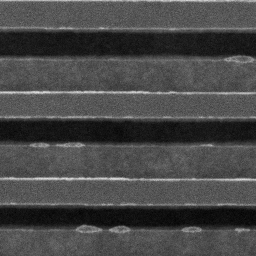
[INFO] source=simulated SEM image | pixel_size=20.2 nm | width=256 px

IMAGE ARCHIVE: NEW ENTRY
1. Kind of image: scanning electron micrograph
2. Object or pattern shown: lines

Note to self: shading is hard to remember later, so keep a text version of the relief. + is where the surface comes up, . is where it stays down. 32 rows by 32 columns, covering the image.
++++++++++++++++++++++++++++++++
++++++++++++++++++++++++++++++++
++++++++++++++++++++++++++++++++
++++++++++++++++++++++++++++++++
................................
................................
................................
++++++.....+.++.............++++
++++++++++++++++++++++++++++++++
++++++++++++++++++++++++++++++++
++++++++++++++++++++++++++++++++
++++++++++++++++++++++++++++++++
++++++++++++++++++++++++++++++++
++++++++++++++++++++++++++++++++
++++++++++++++++++++++++++++++++
................................
................................
................................
++++++++++++++++++++++++++++++++
++++++++++++++++++++++++++++++++
++++++++++++++++++++++++++++++++
++++++++++++++++++++++++++++++++
++++++++++++++++++++++++++++++++
++++++++++++++++++++++++++++++++
++++++++++++++++++++++++++++++++
++++++++++++++++++++++++++++++++
................................
................................
..........++..++.......++.......
++++++++++++++++++++++++++++++++
++++++++++++++++++++++++++++++++
++++++++++++++++++++++++++++++++